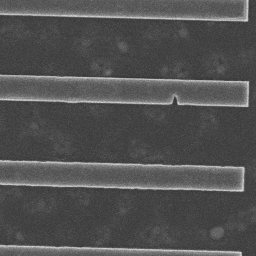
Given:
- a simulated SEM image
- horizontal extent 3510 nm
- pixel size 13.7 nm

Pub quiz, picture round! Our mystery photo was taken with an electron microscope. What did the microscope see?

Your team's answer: one or a few lines or trenches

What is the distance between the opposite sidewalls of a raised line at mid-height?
326 nanometers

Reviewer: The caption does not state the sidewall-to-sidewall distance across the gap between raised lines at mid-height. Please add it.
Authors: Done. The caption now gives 60.7 pixels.